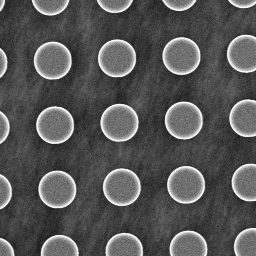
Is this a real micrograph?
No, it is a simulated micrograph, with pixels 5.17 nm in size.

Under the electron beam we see an array of small figures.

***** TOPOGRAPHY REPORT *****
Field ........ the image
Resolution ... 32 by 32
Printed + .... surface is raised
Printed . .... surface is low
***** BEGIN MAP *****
+...++++....++++.....+++.....+++
.....+++......+.................
................................
................................
..............................+.
......++.....+++.....+++.....+++
.....++++...+++++...+++++...++++
+...+++++...+++++...+++++....+++
+...+++++....++++....+++.....+++
.....+++......+.................
................................
................................
..............................+.
......++......++.....++++....+++
+....++++....++++....++++....+++
+....++++....++++....++++....+++
+....++++....++++....++++....+++
+.....++......++................
................................
................................
................................
......++......+++.....+++....+++
+....++++....++++....+++++...+++
+....++++....+++++...+++++...+++
+....++++....++++....++++.....++
+.....+++.....++................
................................
................................
................................
.......+......+++.....+++.....++
+....++++....+++++...+++++...+++
++...+++++...+++++...+++++...+++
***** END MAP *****